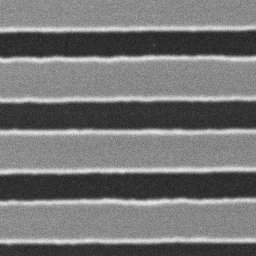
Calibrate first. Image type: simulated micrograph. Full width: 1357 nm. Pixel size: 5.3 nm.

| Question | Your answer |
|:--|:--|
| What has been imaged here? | lines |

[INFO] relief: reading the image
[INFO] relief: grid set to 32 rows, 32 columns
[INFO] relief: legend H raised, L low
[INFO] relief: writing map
HHHHHHHHHHHHHHHHHHHHHHHHHHHHHHHH
HHHHHHHHHHHHHHHHHHHHHHHHHHHHHHHH
HHHHHHHHHHHHHHHHHHHHHHHHHHHHHHHH
HHHHHHHHHHHHHHHHHHHHHHHHHHHHHHHH
LLLLLLLLLLLLLLLLLLLLLLLLLLLLLLLL
LLLLLLLLLLLLLLLLLLLLLLLLLLLLLLLL
LLLLLLLLLLLLLLLLLLLLLLLLLLLLLLLL
HHHHHHHHHHHHHHHHHHHHHHHHHHHHHHHH
HHHHHHHHHHHHHHHHHHHHHHHHHHHHHHHH
HHHHHHHHHHHHHHHHHHHHHHHHHHHHHHHH
HHHHHHHHHHHHHHHHHHHHHHHHHHHHHHHH
HHHHHHHHHHHHHHHHHHHHHHHHHHHHHHHH
HHHHHHHHHHHHHHHHHHHHHHHHHHHHHHHH
LLLLLLLLLLLLLLLLLLLLLLLLLLLLLLLL
LLLLLLLLLLLLLLLLLLLLLLLLLLLLLLLL
LLLLLLLLLLLLLLLLLLLLLLLLLLLLLLLL
HHHHHHHHHHHHHHHHHHHHHHHHHHHHHHHH
HHHHHHHHHHHHHHHHHHHHHHHHHHHHHHHH
HHHHHHHHHHHHHHHHHHHHHHHHHHHHHHHH
HHHHHHHHHHHHHHHHHHHHHHHHHHHHHHHH
HHHHHHHHHHHHHHHHHHHHHHHHHHHHHHHH
HHHHHHHHHHHHHHHHHHHHHHHHHHLLLLLL
LLLLLLLLLLLLLLLLLLLLLLLLLLLLLLLL
LLLLLLLLLLLLLLLLLLLLLLLLLLLLLLLL
LLLLLLLLLLLLLLLLLLLLLLLLLLLLLLLL
HHHHHHHHHHHHHHHHHHHHHHHHHHHHHHHH
HHHHHHHHHHHHHHHHHHHHHHHHHHHHHHHH
HHHHHHHHHHHHHHHHHHHHHHHHHHHHHHHH
HHHHHHHHHHHHHHHHHHHHHHHHHHHHHHHH
HHHHHHHHHHHHHHHHHHHHHHHHHHHHHHHH
LLLLLLLLLLLLLLLLLLLLLLLLLLLLLLLL
LLLLLLLLLLLLLLLLLLLLLLLLLLLLLLLL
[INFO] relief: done